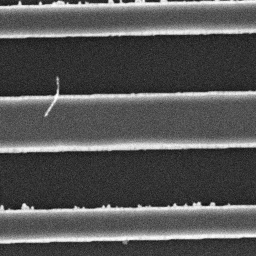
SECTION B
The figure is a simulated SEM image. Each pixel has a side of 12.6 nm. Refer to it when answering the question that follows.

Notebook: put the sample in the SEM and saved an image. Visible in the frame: lines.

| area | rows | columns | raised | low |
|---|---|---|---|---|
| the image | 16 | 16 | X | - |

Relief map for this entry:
XXXXXXXXXXXXXXXX
XXXXXXXXXXXXXXXX
----------------
----------------
----------------
----------------
XXXXXXXXXXXXXXXX
XXXXXXXXXXXXXXXX
XXXXXXXXXXXXXXXX
----------------
----------------
----------------
----------------
XXXXXXXXXXXXXXXX
XXXXXXXXXXXXXXXX
----------------